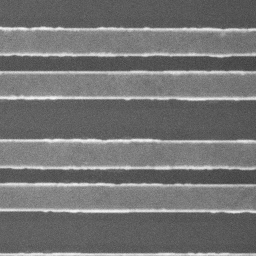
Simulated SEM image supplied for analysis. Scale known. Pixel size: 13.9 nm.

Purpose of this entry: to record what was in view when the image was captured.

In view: lines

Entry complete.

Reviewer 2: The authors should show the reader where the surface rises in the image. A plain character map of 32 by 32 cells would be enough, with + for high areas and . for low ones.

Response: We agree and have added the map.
................................
................................
................................
................................
++++++++++++++++++++++++++++++++
++++++++++++++++++++++++++++++++
++++++++++++++++++++++++++++++++
................................
................................
++++++++++++++++++++++++++++++++
++++++++++++++++++++++++++++++++
++++++++++++++++++++++++++++++++
................................
................................
................................
................................
................................
................................
++++++++++++++++++++++++++++++++
++++++++++++++++++++++++++++++++
++++++++++++++++++++++++++++++++
................................
................................
++++++++++++++++++++++++++++++++
++++++++++++++++++++++++++++++++
++++++++++++++++++++++++++++++++
............................++.+
................................
................................
................................
................................
................................